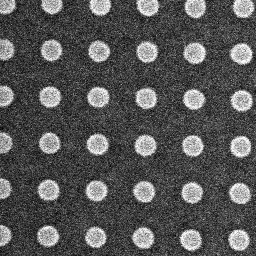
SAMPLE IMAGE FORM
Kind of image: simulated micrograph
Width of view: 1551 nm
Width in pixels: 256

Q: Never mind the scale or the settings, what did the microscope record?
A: a regular array of raised bodies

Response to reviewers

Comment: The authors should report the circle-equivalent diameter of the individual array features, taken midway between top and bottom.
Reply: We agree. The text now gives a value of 121 nanometres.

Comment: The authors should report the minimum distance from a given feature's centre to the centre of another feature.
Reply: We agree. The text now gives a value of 278 nm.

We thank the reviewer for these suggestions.